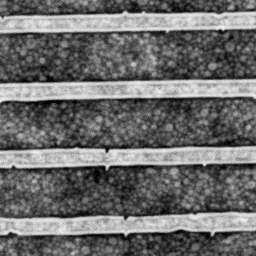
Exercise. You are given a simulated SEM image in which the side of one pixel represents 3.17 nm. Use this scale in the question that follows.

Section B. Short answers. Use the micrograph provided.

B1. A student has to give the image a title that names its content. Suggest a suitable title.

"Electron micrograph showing one or a few lines or trenches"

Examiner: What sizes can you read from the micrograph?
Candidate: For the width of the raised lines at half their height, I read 14.4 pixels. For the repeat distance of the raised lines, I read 0.213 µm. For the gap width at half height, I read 0.167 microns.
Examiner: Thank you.